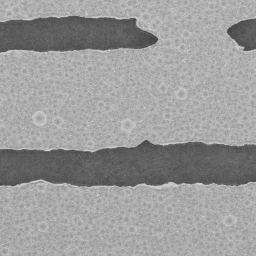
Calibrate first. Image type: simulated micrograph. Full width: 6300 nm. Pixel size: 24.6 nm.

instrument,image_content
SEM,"one or a few lines or trenches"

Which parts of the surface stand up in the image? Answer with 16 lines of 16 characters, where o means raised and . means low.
oooooooooooooooo
.........oooooo.
..........ooooo.
oooooooooooooooo
oooooooooooooooo
oooooooooooooooo
oooooooooooooooo
oooooooooooooooo
oooooooooooooooo
................
................
..o............o
oooooooooooooooo
oooooooooooooooo
oooooooooooooooo
oooooooooooooooo